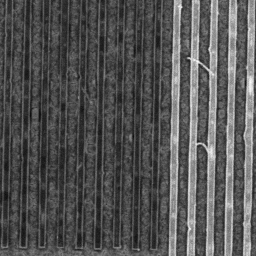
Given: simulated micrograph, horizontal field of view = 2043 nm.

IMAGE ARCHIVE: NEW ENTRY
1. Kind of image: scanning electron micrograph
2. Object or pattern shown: parallel lines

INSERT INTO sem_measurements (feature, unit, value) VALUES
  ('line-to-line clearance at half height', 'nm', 97.7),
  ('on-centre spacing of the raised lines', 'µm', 0.149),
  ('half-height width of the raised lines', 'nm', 49.9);